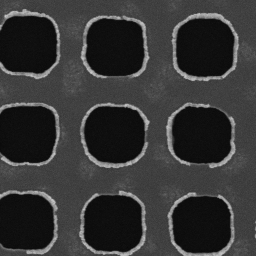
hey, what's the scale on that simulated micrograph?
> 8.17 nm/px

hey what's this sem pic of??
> holes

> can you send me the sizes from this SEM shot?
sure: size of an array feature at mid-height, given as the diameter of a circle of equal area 501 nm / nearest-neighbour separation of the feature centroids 713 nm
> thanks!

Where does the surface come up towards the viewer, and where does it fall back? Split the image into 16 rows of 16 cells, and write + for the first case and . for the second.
++++++++++++++++
...+++...+++..++
....+....++....+
....+....++....+
+..+++..++++..++
++++++++++++++++
++++++++++++++++
...++....++...++
....+....++...++
...+++...++...++
++++++++++++++++
++++++++++++++++
...+++..++++..++
...++....++...++
...++....++...++
+..+++..+++...++